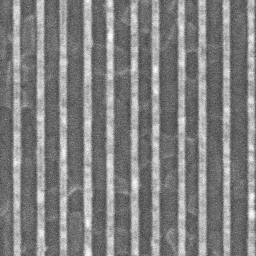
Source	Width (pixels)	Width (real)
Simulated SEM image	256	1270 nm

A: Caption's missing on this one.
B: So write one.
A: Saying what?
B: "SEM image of parallel lines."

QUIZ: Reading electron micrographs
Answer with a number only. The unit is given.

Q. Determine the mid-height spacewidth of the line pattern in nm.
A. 86.8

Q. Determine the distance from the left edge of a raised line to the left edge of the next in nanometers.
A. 116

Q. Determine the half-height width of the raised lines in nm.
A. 30.4